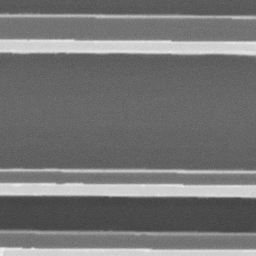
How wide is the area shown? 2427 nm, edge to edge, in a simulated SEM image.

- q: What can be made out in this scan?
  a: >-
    lines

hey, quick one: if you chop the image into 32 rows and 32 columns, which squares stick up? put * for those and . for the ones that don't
................................
................................
********************************
********************************
********************************
********************************
........************************
................................
................................
................................
................................
................................
................................
................................
................................
................................
................................
................................
................................
................................
................................
*********.......................
********************************
********************************
.........................*******
................................
................................
................................
................................
********************************
********************************
********************************